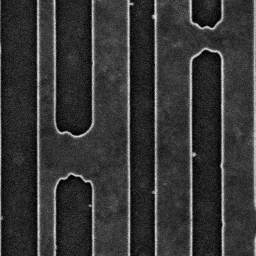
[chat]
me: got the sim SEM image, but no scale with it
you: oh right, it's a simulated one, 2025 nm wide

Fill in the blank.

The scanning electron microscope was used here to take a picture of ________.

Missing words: one or a few lines or trenches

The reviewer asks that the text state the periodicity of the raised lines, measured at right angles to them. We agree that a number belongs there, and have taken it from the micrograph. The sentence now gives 503 nanometers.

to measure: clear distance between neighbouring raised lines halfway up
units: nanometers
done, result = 249